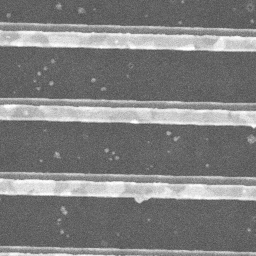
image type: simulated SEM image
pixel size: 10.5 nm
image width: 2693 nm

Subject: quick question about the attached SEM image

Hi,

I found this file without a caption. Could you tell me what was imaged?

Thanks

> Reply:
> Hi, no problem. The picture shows lines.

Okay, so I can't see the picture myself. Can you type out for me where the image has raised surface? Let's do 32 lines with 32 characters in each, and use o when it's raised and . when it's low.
................................
................................
................................
ooooooooooooooooooooooo.........
oooooooooooooooooooooooooooooooo
oooooooooooooooooooooooooooooooo
................................
................................
................................
................................
................................
................................
ooooooooo.......................
oooooooooooooooooooooooooooooooo
oooooooooooooooooooooooooooooooo
........................o.oooooo
................................
................................
................................
................................
................................
................................
oooooooooooooooooooooooooooooooo
oooooooooooooooooooooooooooooooo
..............oooooooooooooooooo
................................
................................
................................
................................
................................
................................
oooooooooooooooooooooooooooo....